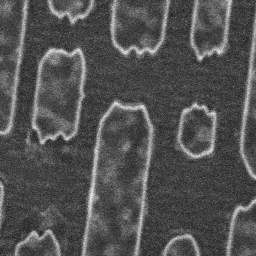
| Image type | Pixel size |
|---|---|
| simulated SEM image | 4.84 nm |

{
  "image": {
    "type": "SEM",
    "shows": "one or a few lines or trenches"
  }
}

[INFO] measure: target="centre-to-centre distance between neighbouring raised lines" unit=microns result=0.342